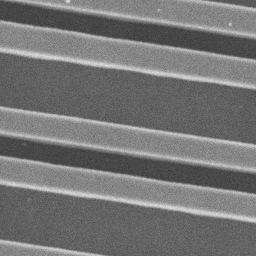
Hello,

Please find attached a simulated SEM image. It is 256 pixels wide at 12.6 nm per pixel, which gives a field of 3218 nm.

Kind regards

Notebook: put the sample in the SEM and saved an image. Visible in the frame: lines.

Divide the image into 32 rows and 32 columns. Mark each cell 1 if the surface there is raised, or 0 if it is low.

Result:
00001111111111111111111111110000
00000000000111111111111111111111
00000000000000000111111111111111
11111000000000000000000011111111
11111111111100000000000000000001
11111111111111111110000000000000
00111111111111111111111111000000
00000000011111111111111111111111
00000000000000011111111111111111
00000000000000000000001111111111
00000000000000000000000000000111
00000000000000000000000000000000
00000000000000000000000000000000
10000000000000000000000000000000
11111111000000000000000000000000
11111111111111000000000000000000
11111111111111111111000000000000
00000111111111111111111111110000
00000000000011111111111111111111
00000000000000000011111111111111
11111100000000000000000000111111
11111111111110000000000000000000
11111111111111111111000000000000
00001111111111111111111111000000
00000000000111111111111111111111
00000000000000000011111111111111
00000000000000000000000001111111
00000000000000000000000000000001
00000000000000000000000000000000
00000000000000000000000000000000
11100000000000000000000000000000
11111111110000000000000000000000